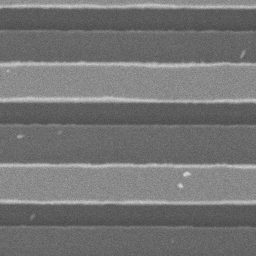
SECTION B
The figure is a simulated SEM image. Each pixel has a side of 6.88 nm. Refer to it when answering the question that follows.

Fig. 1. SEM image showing lines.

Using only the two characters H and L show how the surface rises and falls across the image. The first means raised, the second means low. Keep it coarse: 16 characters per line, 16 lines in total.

LLLLLLLLLLLLLLLH
LLLLLLLLLLLLLLLL
LLLLLLLLLLLLLLLL
LLLLLLLLLLLLLLLL
HHHHHHHHHHHHHHHH
HHHHHHHHHHHHHHHH
LLLLLLLLLLLLLLLL
LLLLLLLLLLLLLLLL
LLLLLLLLLLLLLLLL
LLLLLLLLLLLLLLLL
HHHHHHHHHHHHHHHH
HHHHHHHHHHHHHHHH
HHHHHHHHHHHHHHHH
LLLLLLLLLLLLLLLL
LLLLLLLLLLLLLLLL
LLLLLLLLLLLLLLLL